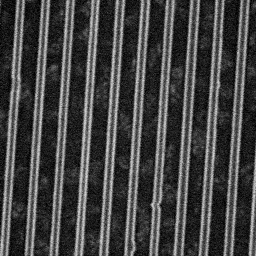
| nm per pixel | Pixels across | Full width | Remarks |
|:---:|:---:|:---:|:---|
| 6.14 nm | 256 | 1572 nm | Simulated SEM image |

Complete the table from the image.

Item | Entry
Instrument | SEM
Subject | parallel lines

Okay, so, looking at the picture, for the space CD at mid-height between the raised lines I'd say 0.113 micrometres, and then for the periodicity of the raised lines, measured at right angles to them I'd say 153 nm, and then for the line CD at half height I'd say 41.4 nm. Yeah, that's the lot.